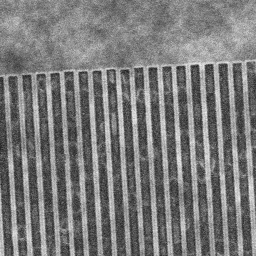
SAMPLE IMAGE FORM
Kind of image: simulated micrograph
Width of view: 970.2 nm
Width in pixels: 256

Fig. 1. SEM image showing parallel lines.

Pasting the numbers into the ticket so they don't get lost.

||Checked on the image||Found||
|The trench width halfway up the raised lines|38.3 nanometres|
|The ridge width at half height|13.7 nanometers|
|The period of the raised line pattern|14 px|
